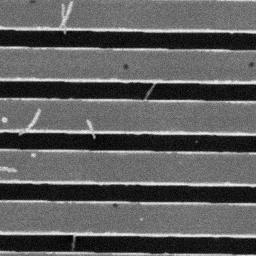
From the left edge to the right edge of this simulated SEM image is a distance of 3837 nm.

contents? lines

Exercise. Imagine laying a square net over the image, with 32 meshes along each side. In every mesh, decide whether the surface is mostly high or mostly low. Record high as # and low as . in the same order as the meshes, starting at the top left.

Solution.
################################
################################
################################
################################
................................
................................
################################
################################
################################
################################
................................
................................
#################...............
################################
################################
################################
################################
................................
................................
################################
################################
################################
################################
................................
................................
################################
################################
################################
################################
.........#.........#############
................................
#...............................